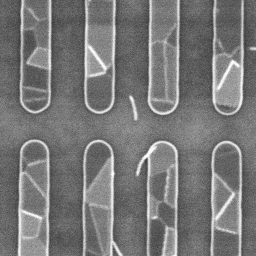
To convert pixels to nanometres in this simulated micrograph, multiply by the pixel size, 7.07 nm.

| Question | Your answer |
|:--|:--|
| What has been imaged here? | groups of lines, slits or small figures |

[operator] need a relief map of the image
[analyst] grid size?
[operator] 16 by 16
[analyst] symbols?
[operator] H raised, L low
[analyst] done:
LHHLLHHLLHHLLHHL
LHHLLHHLLHHLLHHL
LHHLLHHLLHHLLHHL
LHHLLHHLLHHLLHHL
LHHLLHHLLHHLLHHL
LHHLLHHLLHHLLHHL
LHHLLHHLLHHLLHHL
LLLLLLLLLLLLLLLL
LLLLLLLLLLLLLLLL
LHHLLHHLLHHLLHHL
LHHLLHHLLHHLLHHL
LHHLLHHLLHHLLHHL
LHHLLHHLLHHLLHHL
LHHLLHHLLHHLLHHL
LHHLLHHLLHHLLHHL
LHHLLHHLLHHLLHHL